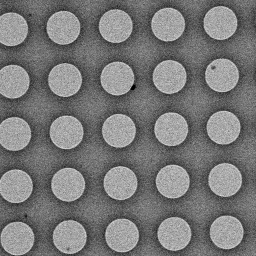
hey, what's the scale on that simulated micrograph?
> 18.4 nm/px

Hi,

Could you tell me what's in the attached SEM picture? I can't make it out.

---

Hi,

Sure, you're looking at an array of small figures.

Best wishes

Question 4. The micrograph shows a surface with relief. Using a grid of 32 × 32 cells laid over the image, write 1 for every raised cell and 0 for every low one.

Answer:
00000000000000000000000000000000
00000001000001110000110000111000
11100011110001110001111000111100
11100011110011110001111000111000
11100011110001110000110000111000
11000000000000000000000000000000
00000000000000000000000000000000
00000000000000000000000000010000
11100001100001110001111000111100
11100011110001111001111000111100
11110011110001111001111000111000
11100001100000110000110000000000
00000000000000000000000000000000
00000000000000000000000000000000
00000000000000110000111000111000
11100001110001111001111000111100
11110011110001111001111000111100
11110011110001111000111000011000
01100000100000000000000000000000
00000000000000000000000000000000
00000000000000000000000000001000
01100001110000111000111000111100
11110001111001111000111100111100
11110001111001111000111000111100
11110001110000110000011000000000
00000000000000000000000000000000
00000000000000000000000000000000
00000000000000010000011000011100
01110001110001111000111100111100
11110001111001111000111100111100
11110001111000111000111000011100
01100000110000000000000000000000